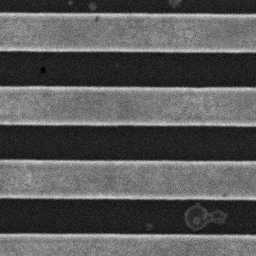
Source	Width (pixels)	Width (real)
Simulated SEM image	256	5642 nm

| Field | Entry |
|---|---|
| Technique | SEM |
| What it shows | wiring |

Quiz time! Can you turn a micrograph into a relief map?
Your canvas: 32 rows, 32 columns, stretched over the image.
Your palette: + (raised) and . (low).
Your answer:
................................
................................
++++++++++++++++++++++++++++++++
++++++++++++++++++++++++++++++++
++++++++++++++++++++++++++++++++
++++++++++++++++++++++++++++++++
............................++..
................................
................................
................................
................................
++++++++++++++++++++++++++++++++
++++++++++++++++++++++++++++++++
++++++++++++++++++++++++++++++++
++++++++++++++++++++++++++++++++
....++++++++++++++++++++++++++++
................................
................................
................................
................................
++++++++++++++++++++++++++++++++
++++++++++++++++++++++++++++++++
++++++++++++++++++++++++++++++++
++++++++++++++++++++++++++++++++
++++++++++++++++++++++++++++++++
................................
................................
................................
................................
++++++++++++++++++++++++++++++++
++++++++++++++++++++++++++++++++
++++++++++++++++++++++++++++++++